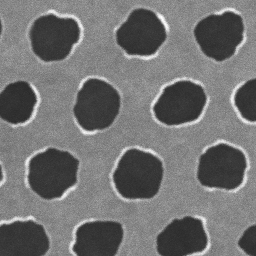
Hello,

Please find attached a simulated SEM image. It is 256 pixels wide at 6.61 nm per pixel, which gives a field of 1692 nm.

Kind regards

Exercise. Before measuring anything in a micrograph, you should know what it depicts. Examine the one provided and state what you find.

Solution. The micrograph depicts a regular array of holes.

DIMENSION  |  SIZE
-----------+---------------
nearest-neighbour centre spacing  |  524 nanometres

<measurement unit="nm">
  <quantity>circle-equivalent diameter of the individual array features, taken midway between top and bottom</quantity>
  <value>322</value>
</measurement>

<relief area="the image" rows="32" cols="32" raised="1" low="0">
11111111111111111111111111111111
11111111111111110001111111110111
11110000011111110000111110000011
11110000001111100000011100000001
11110000001111000000011100000011
11110000011111100000111110000011
11110000011111110001111110000111
11111000111111111111111111101111
11111111111111111111111111111111
11111111111111111111111111111111
10001111110000111111100001111100
00001111110000011111000000111100
00000111110000011111000000111000
00001111100000011110000001111100
00001111100000011110000001111100
11111111110000111111100111111111
11111111111111111111111111111111
11111111111111111111111111111111
11111101111111111111111111000111
11110000011111100001111110000001
11110000001111100000111110000001
11110000001111000000111110000001
11100000001111000000111110000011
11110000011111000000111111000011
11111000111111100001111111111111
11111111111111111111111111111111
11111111111111111111111111111111
11111111111111111111110001111111
00000111110000011111100001111110
00000011100000011111000000111100
00000011100000011110000000111100
00000011100000011111000001111110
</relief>